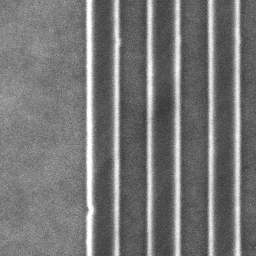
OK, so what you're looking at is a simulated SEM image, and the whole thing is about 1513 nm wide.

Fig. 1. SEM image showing parallel lines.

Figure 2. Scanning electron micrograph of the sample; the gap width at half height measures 0.183 micrometres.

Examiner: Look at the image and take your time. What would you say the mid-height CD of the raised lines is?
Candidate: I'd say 0.171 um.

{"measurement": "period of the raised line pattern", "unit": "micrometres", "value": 0.358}